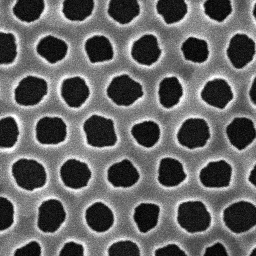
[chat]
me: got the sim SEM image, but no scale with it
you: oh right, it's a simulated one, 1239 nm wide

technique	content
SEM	a regular array of holes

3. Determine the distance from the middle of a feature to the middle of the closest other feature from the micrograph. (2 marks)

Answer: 222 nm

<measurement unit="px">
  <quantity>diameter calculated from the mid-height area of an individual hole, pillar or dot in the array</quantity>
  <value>30.8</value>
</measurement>